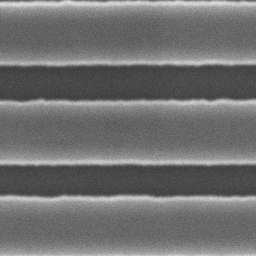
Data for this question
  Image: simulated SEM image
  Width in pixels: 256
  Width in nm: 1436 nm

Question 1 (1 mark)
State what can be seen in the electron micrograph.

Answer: lines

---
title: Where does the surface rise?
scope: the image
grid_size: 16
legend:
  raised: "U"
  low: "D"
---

UUUUUUUUUUUUUUUU
UUUUUUUUUUUUUUUU
UUUUUUUUUUUUUUUU
UUUUUUUUUUUUUUUU
DDDDDDDDDDDDDDDD
DDDDDDDDDDDDDDDD
UUUUUUUUUUUUUUUU
UUUUUUUUUUUUUUUU
UUUUUUUUUUUUUUUU
UUUUUUUUUUUUUUUU
DDDDDDDDDDDDDDDD
DDDDDDDDDDDDDDDD
UUUUUUUUUUUUUUUU
UUUUUUUUUUUUUUUU
UUUUUUUUUUUUUUUU
UUUUUUUUUUUUUUUU